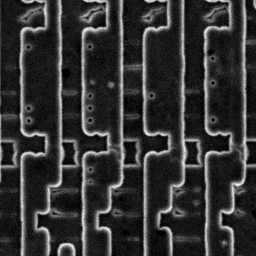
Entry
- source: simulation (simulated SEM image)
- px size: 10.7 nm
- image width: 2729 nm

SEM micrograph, wiring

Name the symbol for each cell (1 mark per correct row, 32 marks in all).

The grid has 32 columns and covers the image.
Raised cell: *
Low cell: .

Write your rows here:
.....***.....**......**.....***.
......**.....**......**......**.
......**.....**......**......**.
...*****...****....****...*****.
...*****..*****...*****...*****.
...*****..*****...*****...*****.
...*****..*****...*****...*****.
...*****..*****...*****...*****.
...*****..*****...*****...*****.
...*****..*****...*****...*****.
...*****..*****...*****...*****.
...*****..*****...*****...*****.
...*****..*****...*****...*****.
...*****..*****...*****...*****.
...*****..*****...*****...*****.
...*****..*****...*****...*****.
...*****...****...*****...*****.
......**.....**......**......**.
......**.....**......**......**.
...*****...****...*****...*****.
...*****..*****...*****...*****.
...*****..*****...*****...*****.
...*****..*****...*****...*****.
...***....****....****....***...
...***....****....***.....***...
...***....****....***.....***...
...***....***.....**......***...
...**.....**......**......**....
...**.....***.....***.....***...
...***....****....***.....***...
...***..*.****....***.....***...
...***.**.****....***.....***...